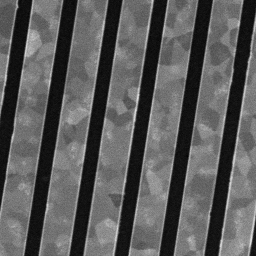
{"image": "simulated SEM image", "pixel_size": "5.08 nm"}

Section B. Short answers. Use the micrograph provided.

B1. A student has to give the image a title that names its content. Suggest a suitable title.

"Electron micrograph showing parallel lines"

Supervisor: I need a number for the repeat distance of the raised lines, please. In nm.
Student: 226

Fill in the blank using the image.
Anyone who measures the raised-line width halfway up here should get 146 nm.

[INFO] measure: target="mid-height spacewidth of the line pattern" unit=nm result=81.6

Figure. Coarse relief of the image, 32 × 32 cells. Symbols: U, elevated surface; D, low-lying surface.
UUDDUUUUDDUUUDDUUUUDDUUUUDDUUUDD
UUDDUUUUDDUUUDDUUUUDDUUUDDUUUUDD
UUDDUUUDDUUUUDDUUUUDDUUUDDUUUUDD
UUDDUUUDDUUUUDDUUUUDDUUUDDUUUUDD
UDDUUUUDDUUUUDDUUUDDUUUUDDUUUUDD
UDDUUUUDDUUUUDDUUUDDUUUUDDUUUUDD
UDDUUUUDDUUUDDUUUUDDUUUUDDUUUDDU
UDDUUUUDDUUUDDUUUUDDUUUUDDUUUDDU
UDDUUUUDDUUUDDUUUUDDUUUDDUUUUDDU
UDDUUUDDUUUUDDUUUUDDUUUDDUUUUDDU
UDDUUUDDUUUUDDUUUUDUUUUDDUUUUDDU
DDUUUUDDUUUUDDUUUDDUUUUDDUUUUDDU
DDUUUUDDUUUUDUUUUDDUUUUDDUUUDDUU
DDUUUUDDUUUDDUUUUDDUUUUDDUUUDDUU
DDUUUUDDUUUDDUUUUDDUUUDDDUUUDDUU
DDUUUDDUUUUDDUUUUDDUUUDDUUUUDDUU
DDUUUDDUUUUDDUUUUDDUUUDDUUUUDDUU
DDUUUDDUUUUDDUUUDDUUUUDDUUUUDDUU
DUUUUDDUUUUDDUUUDDUUUUDDUUUUDUUU
DUUUUDDUUUDDUUUUDDUUUUDDUUUDDUUU
DUUUUDDUUUDDUUUUDDUUUUDDUUUDDUUU
DUUUUDDUUUDDUUUUDDUUUDDUUUUDDUUU
DUUUDDUUUUDDUUUUDDUUUDDUUUUDDUUU
DUUUDDUUUUDDUUUDDUUUUDDUUUUDDUUU
UUUUDDUUUUDDUUUDDUUUUDDUUUUDDUUU
UUUUDDUUUUDUUUUDDUUUUDDUUUDDUUUU
UUUUDDUUUDDUUUUDDUUUUDDUUUDDUUUU
UUUUDDUUUDDUUUUDDUUUDDDUUUDDUUUU
UUUDDUUUUDDUUUUDDUUUDDUUUUDDUUUU
UUUDDUUUUDDUUUUDDUUUDDUUUUDDUUUD
UUUDDUUUUDDUUUDDUUUUDDUUUUDDUUUD
UUUDDUUUUDDUUUDDUUUUDDUUUUDDUUUD